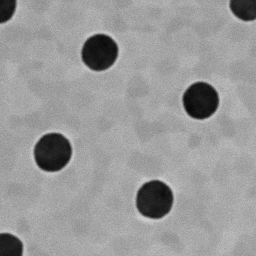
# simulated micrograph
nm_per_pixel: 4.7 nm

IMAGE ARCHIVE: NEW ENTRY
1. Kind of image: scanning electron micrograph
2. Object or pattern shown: holes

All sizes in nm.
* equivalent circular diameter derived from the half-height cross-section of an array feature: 185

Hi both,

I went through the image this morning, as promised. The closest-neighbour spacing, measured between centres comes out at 516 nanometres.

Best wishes